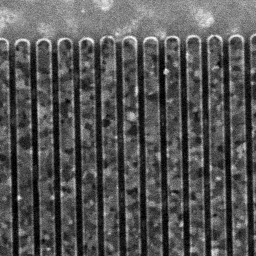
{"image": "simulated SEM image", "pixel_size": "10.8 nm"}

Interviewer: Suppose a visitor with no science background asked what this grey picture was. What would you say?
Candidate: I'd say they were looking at parallel lines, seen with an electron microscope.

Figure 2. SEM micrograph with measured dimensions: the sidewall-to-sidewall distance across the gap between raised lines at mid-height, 6.88 px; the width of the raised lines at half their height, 150 nm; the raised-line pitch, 231 nm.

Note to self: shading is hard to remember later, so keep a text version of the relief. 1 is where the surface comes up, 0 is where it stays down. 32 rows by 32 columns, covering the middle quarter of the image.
11001110011110011100111000111001
11001110011110011100111001111001
11001110011110011100111001111001
11001110011110011100111000111001
11001110011110011100111000111001
11001111011110011100111000111001
11001111011110011100111000111001
11001111001110011100111100111001
11001111001110011100111100111001
11001111001110011100111100111001
11001111001110011100111100111001
11001111001110011100111100111001
11001111001110011100111100111001
11001111001110011100111100111001
11001111001110011100111100111001
11000111001110011100111100111001
11000111001110011110111100111001
11000111001110011110111100111001
11000111001110011110011100111001
11000111001110011110011100111001
11000111001110011110011100111001
11000111001110011110011100111001
11000111001110011110011100111001
11000111001110011110011100111001
11100111001110011110011100111001
11100111001110011110011100111001
11100111001110011110011100111001
11100111001110011110011100111001
11100111001110011110011100111001
11100111001110011110011100111000
11100111001110011110011100111000
11100111001110011110011100111000